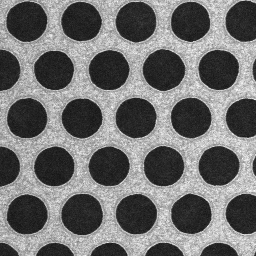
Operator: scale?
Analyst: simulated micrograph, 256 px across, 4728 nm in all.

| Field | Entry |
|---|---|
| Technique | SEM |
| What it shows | a regular array of holes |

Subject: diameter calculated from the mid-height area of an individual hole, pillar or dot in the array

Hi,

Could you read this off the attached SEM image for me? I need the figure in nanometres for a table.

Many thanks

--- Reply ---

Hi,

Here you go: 751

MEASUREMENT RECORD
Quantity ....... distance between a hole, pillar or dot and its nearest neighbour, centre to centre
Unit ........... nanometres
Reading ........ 1010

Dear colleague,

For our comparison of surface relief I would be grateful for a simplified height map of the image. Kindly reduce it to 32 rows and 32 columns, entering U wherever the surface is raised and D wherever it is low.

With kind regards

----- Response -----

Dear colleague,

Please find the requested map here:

UUDDDUUUUDDUUUUUDDUUUUUDDUUUUDDD
UDDDDDUUDDDDUUUDDDDUUUDDDDUUDDDD
UDDDDDUUDDDDDUDDDDDDUDDDDDUUDDDD
UDDDDDUUDDDDDUUDDDDUUDDDDDUUDDDD
UUDDDUUUDDDDUUUDDDDUUUDDDDUUUDDD
UUUUUUUUUUUUUUUUUUUUUUUUUUUUUUUU
DUUUUUDDUUUUUDDUUUUDDDUUUUDDDUUU
DDUUUDDDDUUDDDDDUUDDDDDUUDDDDDUU
DDDUDDDDDUUDDDDDUUDDDDDUUDDDDDUU
DDUUDDDDDUUDDDDDUUDDDDDUUDDDDDUU
DDUUUDDDDUUUDDDUUUUDDDUUUUDDDUUU
UUUUUUUUUUUUUUUUUUUUUUUUUUUUUUUU
UUDDUUUUUDDUUUUUDDUUUUUDDUUUUUDD
UDDDDDUUDDDDUUUDDDDUUUDDDDUUUDDD
UDDDDDUUDDDDDUDDDDDDUDDDDDUUDDDD
UDDDDDUUDDDDDUUDDDDUUDDDDDUUDDDD
UDDDDUUUDDDDUUUDDDDUUUDDDDUUUDDD
UUUUUUUUUUUUUUUUUUUUUUUUUUUUUUUU
DUUUUUDDUUUUUDDUUUUDDUUUUUDDUUUU
DDUUUDDDDUUDDDDDUUDDDDDUUDDDDDUU
DDUUDDDDDUUDDDDDUUDDDDDUUDDDDDUU
DDUUDDDDDUUDDDDDUUDDDDDUUDDDDDUU
DDUUUDDDDUUUDDDUUUUDDDUUUUDDDUUU
UUUUUUUUUUUUUUUUUUUUUUUUUUUUUUUU
UUDDUUUUUDDDUUUUDDUUUUUDDUUUUUDD
UDDDDDUUDDDDDUUDDDDUUUDDDDUUUDDD
UDDDDDUUDDDDDUUDDDDDUDDDDDUUDDDD
UDDDDDUUDDDDDUUDDDDUUDDDDDUUDDDD
UDDDDUUUDDDDUUUDDDDUUUDDDDUUUDDD
UUUUUUUUUUUUUUUUUUUUUUUUUUUUUUUU
DUUUUUDDUUUUUDDUUUUUDUUUUUDDUUUU
DDUUUDDDDUUUDDDDUUDDDDDUUDDDDDUU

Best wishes